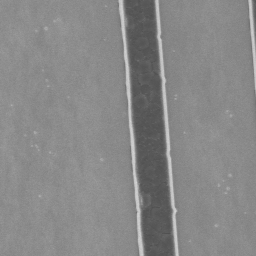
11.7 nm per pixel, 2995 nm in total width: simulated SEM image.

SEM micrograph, one or a few lines or trenches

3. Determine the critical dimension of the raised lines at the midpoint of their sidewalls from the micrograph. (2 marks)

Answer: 37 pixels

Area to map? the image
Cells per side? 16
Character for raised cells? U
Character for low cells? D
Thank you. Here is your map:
DDDDDDDDUUDDDDDD
DDDDDDDDUUDDDDDD
DDDDDDDDUUDDDDDD
DDDDDDDDUUDDDDDD
DDDDDDDDUUDDDDDD
DDDDDDDDUUDDDDDD
DDDDDDDDUUDDDDDD
DDDDDDDDUUDDDDDD
DDDDDDDDUUUDDDDD
DDDDDDDDUUUDDDDD
DDDDDDDDUUUDDDDD
DDDDDDDDUUUDDDDD
DDDDDDDDDUUDDDDD
DDDDDDDDDUUDDDDD
DDDDDDDDDUUDDDDD
DDDDDDDDDUUDDDDD